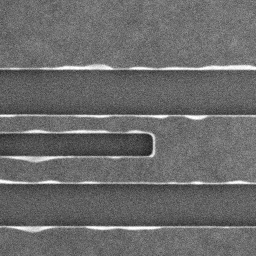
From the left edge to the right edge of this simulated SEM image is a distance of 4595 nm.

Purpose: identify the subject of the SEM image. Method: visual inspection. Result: groups of lines, slits or small figures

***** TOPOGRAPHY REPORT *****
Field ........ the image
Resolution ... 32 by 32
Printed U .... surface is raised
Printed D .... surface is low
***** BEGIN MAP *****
UUUUUUUUUUUUUUUUUUUUUUUUUUUUUUUU
UUUUUUUUUUUUUUUUUUUUUUUUUUUUUUUU
UUUUUUUUUUUUUUUUUUUUUUUUUUUUUUUU
UUUUUUUUUUUUUUUUUUUUUUUUUUUUUUUU
UUUUUUUUUUUUUUUUUUUUUUUUUUUUUUUU
UUUUUUUUUUUUUUUUUUUUUUUUUUUUUUUU
UUUUUUUUUUUUUUUUUUUUUUUUUUUUUUUU
UUUUUUUUUUUUUUUUUUUUUUUUUUUUUUUU
UUUUUUUUDDDDDUUUUDUUUUUUUUDDDDDD
DDDDDDDDDDDDDDDDDDDDDDDDDDDDDDDD
DDDDDDDDDDDDDDDDDDDDDDDDDDDDDDDD
DDDDDDDDDDDDDDDDDDDDDDDDDDDDDDDD
DDDDDDDDDDDDDDDDDDDDDDDDDDDDDDDD
DDDDDDDDDDDDDDDDDDDDDDDDDDDDDDDD
UUUUUUUUUUDDDUUUUDDDDUUDDDDUDDDD
UUUUUUUUUUUUUUUUUUUUUUUUUUUUUUUU
UUUUDUUUUDDDDUUUUUUUUUUUUUUUUUUU
DDDDDDDDDDDDDDDDDDDUUUUUUUUUUUUU
DDDDDDDDDDDDDDDDDDDUUUUUUUUUUUUU
DDDDDDDDDDDDDDDDDDDUUUUUUUUUUUUU
UUUUUUUUUUUUUUUUUUUUUUUUUUUUUUUU
UUUUUUUUUUUUUUUUUUUUUUUUUUUUUUUU
UUUUUUUUUUUUUUUUUUUUUUUUUUUUUUUU
DDDDDDDDDDDDDDDDDDDDDDDDDDDDDDDD
DDDDDDDDDDDDDDDDDDDDDDDDDDDDDDDD
DDDDDDDDDDDDDDDDDDDDDDDDDDDDDDDD
DDDDDDDDDDDDDDDDDDDDDDDDDDDDDDDD
DDDDDDDDDDDDDDDDDDDDDDDDDDDDDDDD
UUUDDUUUUUUUDUUUDDDUUUUUUUUUUUUU
UUUUUUUUUUUUUUUUUUUUUUUUUUUUUUUU
UUUUUUUUUUUUUUUUUUUUUUUUUUUUUUUU
UUUUUUUUUUUUUUUUUUUUUUUUUUUUUUUU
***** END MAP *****